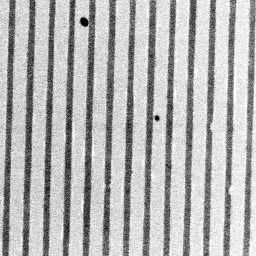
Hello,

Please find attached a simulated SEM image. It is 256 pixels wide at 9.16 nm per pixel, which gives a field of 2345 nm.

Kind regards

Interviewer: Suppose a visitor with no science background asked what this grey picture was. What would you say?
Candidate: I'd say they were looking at parallel lines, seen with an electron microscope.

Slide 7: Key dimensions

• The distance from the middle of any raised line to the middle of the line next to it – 0.184 µm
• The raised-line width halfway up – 68.7 nanometres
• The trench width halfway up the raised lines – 117 nm